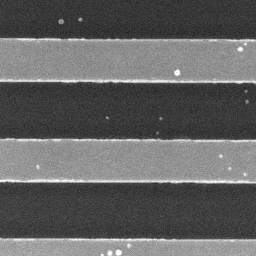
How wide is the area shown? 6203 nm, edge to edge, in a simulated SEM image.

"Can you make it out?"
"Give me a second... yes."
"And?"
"lines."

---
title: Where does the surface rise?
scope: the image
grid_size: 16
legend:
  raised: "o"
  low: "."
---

................
................
oooooo.o........
oooooooooooooooo
oooooooooooooooo
................
................
................
................
oooooooooooooooo
oooooooooooooooo
................
................
................
................
oooooooooooooooo